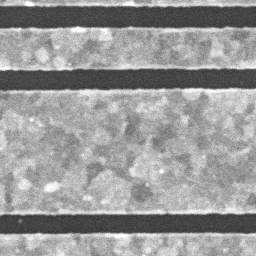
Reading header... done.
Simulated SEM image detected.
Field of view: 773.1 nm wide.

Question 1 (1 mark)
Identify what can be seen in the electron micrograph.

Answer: lines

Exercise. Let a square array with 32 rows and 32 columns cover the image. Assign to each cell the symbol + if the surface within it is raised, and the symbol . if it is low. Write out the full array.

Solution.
++++++++++++++++++++++++++++++++
................................
................................
............................+...
++++++++++++++++++++++++++++++++
++++++++++++++++++++++++++++++++
++++++++++++++++++++++++++++++++
++++++++++++++++++++++++++++++++
+++++++++++++++++......++....+..
................................
................................
++++++++++++++++++++++++++++++++
++++++++++++++++++++++++++++++++
++++++++++++++++++++++++++++++++
++++++++++++++++++++++++++++++++
++++++++++++++++++++++++++++++++
++++++++++++++++++++++++++++++++
++++++++++++++++++++++++++++++++
++++++++++++++++++++++++++++++++
++++++++++++++++++++++++++++++++
++++++++++++++++++++++++++++++++
++++++++++++++++++++++++++++++++
++++++++++++++++++++++++++++++++
++++++++++++++++++++++++++++++++
++++++++++++++++++++++++++++++++
++++++++++++++++++++++++++++++++
++++++++++++++++++++++++++.+++++
................................
................................
++++++++++++++++++++++++++++++++
++++++++++++++++++++++++++++++++
++++++++++++++++++++++++++++++++